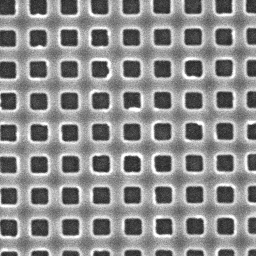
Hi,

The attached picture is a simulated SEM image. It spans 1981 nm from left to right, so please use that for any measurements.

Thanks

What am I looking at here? a regular array of holes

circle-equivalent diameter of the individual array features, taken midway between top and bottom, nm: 152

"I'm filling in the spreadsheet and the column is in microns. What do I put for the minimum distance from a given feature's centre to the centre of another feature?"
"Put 0.238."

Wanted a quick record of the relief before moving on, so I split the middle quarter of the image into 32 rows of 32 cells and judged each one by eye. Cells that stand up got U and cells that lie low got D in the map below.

DDDDUUUDDDDUUUUDDDDUUUDDDDDUUUDD
DDDDUUUDDDDUUUUDDDDUUUDDDDDUUUDD
DDDDUUUDDDDUUUUDDDDUUUDDDDDUUUDD
DDDUUUUUDDUUUUUUDDUUUUUDDDUUUUUU
UUUUUUUUUUUUUUUUUUUUUUUUUUUUUUUU
UUUUUUUUUUUUUUUUUUUUUUUUUUUUUUUU
UUUUUUUUUUUUUUUUUUUUUUUUUUUUUUUU
DDDUUUUDDDDUUUUDDDDUUUUDDDDUUUDD
DDDDUUUDDDDUUUUDDDDUUUDDDDDUUUDD
DDDDUUUDDDDUUUUDDDDUUUDDDDDUUUDD
DDDDUUUDDDDDUUUDDDDUUUUDDDDUUUDD
DDDUUUUUDUUUUUUUUUUUUUUUUUUUUUUU
UUUUUUUUUUUUUUUUUUUUUUUUUUUUUUUU
UUUUUUUUUUUUUUUUUUUUUUUUUUUUUUUU
UUUUUUUUUUUUUUUUUUUUUUUUUUUUUUUU
DDDUUUUDDDDUUUUDDDDUUUDDDDDUUUDD
DDDDUUUDDDDDUUDDDDDUUUDDDDDUUUDD
DDDDUUUDDDDDUUUDDDDUUUDDDDDUUUDD
DDDDUUUDDDDDUUUDDDDUUUDDDDDUUUDD
UUUUUUUUUUUUUUUUUUUUUUUUUUUUUUUU
UUUUUUUUUUUUUUUUUUUUUUUUUUUUUUUU
UUUUUUUUUUUUUUUUUUUUUUUUUUUUUUUU
UUUUUUUUUUUUUUUUUUUUUUUUDDUUUUUD
DDDDUUUDDDDDUUUDDDDUUUDDDDDUUUDD
DDDDUUUDDDDDUUUDDDDUUUDDDDDUUUDD
DDDDUUUDDDDDUUUDDDDUUUDDDDDUUUDD
DDDDUUUDDDDUUUUDDDDUUUUDDDDUUUUD
UUUUUUUUUUUUUUUUUUUUUUUUUUUUUUUU
UUUUUUUUUUUUUUUUUUUUUUUUUUUUUUUU
UUUUUUUUUUUUUUUUUUUUUUUUUUUUUUUU
UUUUUUUUDUUUUUUUDDUUUUUDUUUUUUUD
DDDDUUUDDDDUUUUDDDDUUUDDDDDUUUDD